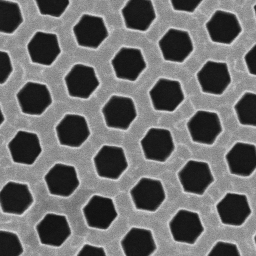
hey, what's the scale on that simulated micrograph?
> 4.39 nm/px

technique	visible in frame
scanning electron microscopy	a regular array of holes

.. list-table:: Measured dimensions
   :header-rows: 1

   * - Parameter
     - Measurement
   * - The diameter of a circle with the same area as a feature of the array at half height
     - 0.14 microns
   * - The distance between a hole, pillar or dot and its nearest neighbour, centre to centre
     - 218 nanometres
